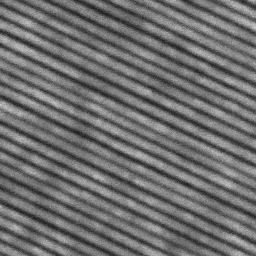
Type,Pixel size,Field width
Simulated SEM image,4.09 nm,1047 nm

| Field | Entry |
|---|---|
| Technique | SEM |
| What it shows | parallel lines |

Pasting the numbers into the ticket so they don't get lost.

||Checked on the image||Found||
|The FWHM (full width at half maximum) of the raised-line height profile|0.0282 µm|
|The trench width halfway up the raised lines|21.3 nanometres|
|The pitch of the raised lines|48.6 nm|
